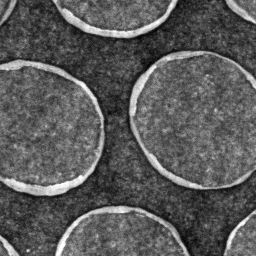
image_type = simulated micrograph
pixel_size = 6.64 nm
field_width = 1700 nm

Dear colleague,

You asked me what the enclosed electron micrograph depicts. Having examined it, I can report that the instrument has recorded raised bodies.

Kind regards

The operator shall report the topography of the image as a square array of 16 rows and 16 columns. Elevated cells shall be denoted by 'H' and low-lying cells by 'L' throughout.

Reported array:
HLLLHHHHHHHLLLLH
LLLLLHHHHHLLLLLL
LLLLLLLLLLLLLLLL
LLLLLLLLLLLHHHLL
HHHHLLLLLHHHHHHL
HHHHHLLLHHHHHHHH
HHHHHHLLHHHHHHHH
HHHHHHLLHHHHHHHH
HHHHHHLLLHHHHHHH
HHHHHHLLLHHHHHHH
HHHHHHLLLLHHHHHH
LHHHHLLLLLLLHHHL
LLLLLLLLLLLLLLLL
LLLLLHHHHHLLLLLL
LLLLHHHHHHHLLLLH
HLLLHHHHHHHLLLHH